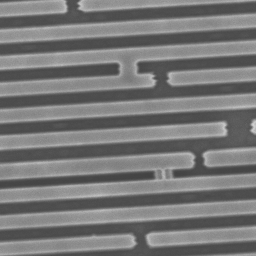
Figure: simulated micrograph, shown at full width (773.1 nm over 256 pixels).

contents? parallel lines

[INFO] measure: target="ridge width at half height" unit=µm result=0.0434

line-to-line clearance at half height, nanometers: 37.7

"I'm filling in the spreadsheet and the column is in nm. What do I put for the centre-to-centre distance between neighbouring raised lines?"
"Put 80.2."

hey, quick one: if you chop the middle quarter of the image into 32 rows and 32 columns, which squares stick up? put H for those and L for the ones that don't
LLLLLLLLLLLLLLHHHHLLLLLLLLLLLLLL
LLLLLLLLLLLLLLHHHHLLLLLLLLLLLLLL
LLLLLLLLLLLLLLHHHHHLLHLLLLHHHHHH
LHHHLHHHHHHHHHHHHHHHHHLLLLHHHHHH
HHHHHHHHHHHHHHHHHHHHHHHLLLHHHHHH
HHHHHHHHHHHHHHHHHHHHHHLLLLLLLLLL
HHHHHHHHHHHLLLLLLLLLLLLLLLLLLLLL
LLLLLLLLLLLLLLLLLLLLLLLLLLLLLLLL
LLLLLLLLLLLLLLLLLLLLLLLLLLLLLHHH
LLLLLLLLLLLLLHHHHHHHHHHHHHHHHHHH
HHHHHHHHHHHHHHHHHHHHHHHHHHHHHHHH
HHHHHHHHHHHHHHHHHHHHHHHHHHHHHHHH
HHHHHHHHHHHHHHHHHHHHLLLLLLLLLLLL
HHHLLLLLLLLLLLLLLLLLLLLLLLLLLLLL
LLLLLLLLLLLLLLLLLLLLLLLLLLLLLLLL
LLLLLLLLLLLLLLLLLLLLLLLLLHHHHHHH
LLLLLLLLLHHHHHHHHHHHHHHHHHHHHHHH
HHHHHHHHHHHHHHHHHHHHHHHHHHHHHHHH
HHHHHHHHHHHHHHHHHHHHHHHHHHHHHHHH
HHHHHHHHHHHHHHHHLLLLLLLLLLLLLLLL
LLLLLLLLLLLLLLLLLLLLLLLLLLLLLLLL
LLLLLLLLLLLLLLLLLLLLLLLLLLLLLLLL
LLLLLLLLLLLLLLLLLLLLLLLLLHHHHHHH
LLLLLLLLLHHHHHHHHHHHHHHHHHHHHHHH
HHHHHHHHHHHHHHHHHHHHHHHHHHHHHHHH
HHHHHHHHHHHHHHHHHHHHHHHHHHHHHHHH
HHHHHHHHHHHHHHHHHHHHHHHHHHHLLLLL
HHHHHHHHHHLLLLLLLLLLLLLHHHHLLLLL
LLLLLLLLLLLLLLLLLLLLLLLHHHHHLLHH
LLLLLLLLLLLLLLHHHHHHHHHHHHHHHHHH
HHHHHHHHHHHHHHHHHHHHHHHHHHHHHHHH
HHHHHHHHHHHHHHHHHHHHHHHHHHHHHHHH